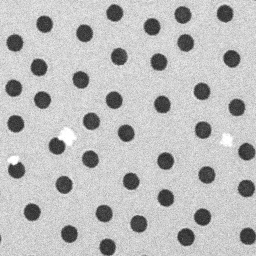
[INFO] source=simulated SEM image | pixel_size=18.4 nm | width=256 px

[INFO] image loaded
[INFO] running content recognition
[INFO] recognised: a regular array of holes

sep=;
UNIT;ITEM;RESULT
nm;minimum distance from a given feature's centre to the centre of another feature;662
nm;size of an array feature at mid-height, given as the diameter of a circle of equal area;334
